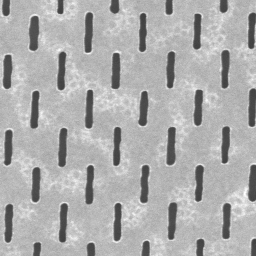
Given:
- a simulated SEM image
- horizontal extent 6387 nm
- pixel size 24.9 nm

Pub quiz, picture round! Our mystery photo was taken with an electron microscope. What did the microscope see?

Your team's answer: a regular array of holes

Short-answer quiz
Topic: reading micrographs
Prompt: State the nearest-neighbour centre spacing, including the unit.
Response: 1150 nm